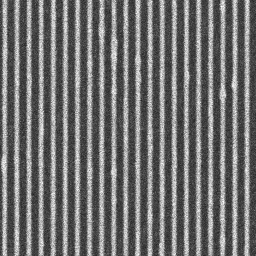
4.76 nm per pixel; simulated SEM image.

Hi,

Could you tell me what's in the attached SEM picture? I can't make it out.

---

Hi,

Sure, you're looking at parallel lines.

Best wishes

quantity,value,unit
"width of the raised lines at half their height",21.4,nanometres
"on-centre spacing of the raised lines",0.0576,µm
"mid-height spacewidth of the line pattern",35.7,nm